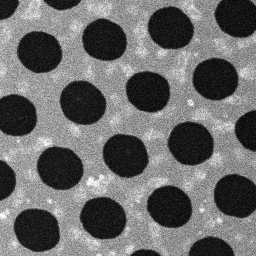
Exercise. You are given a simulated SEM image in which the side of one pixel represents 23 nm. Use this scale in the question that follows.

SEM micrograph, a regular array of holes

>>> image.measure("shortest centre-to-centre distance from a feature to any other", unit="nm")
1520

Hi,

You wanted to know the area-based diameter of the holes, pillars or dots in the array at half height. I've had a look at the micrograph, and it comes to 1030 nm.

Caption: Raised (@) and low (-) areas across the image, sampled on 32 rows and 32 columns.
--@@@@----@@@@@@@@@@@@@@@@@-----
--@@@@@@@@@@@@@@@@@----@@@@-----
@@@@@@@@@@@@--@@@@@-----@@@-----
@@@@@@@@@@@----@@@------@@@-----
@@@----@@@------@@@-----@@@@@--@
@@-----@@@------@@@@----@@@@@@@@
@@------@@@-----@@@@@@@@@@@@@@@@
@@------@@@@@-@@@@@@@@@@@@--@@@@
@@@----@@@@@@@@@@@@@@@@@-----@@@
@@@@@@@@@@@@@@@@@---@@@@------@@
@@@@@@@@@---@@@@-----@@@------@@
@@@@@@@@-----@@@-----@@@@----@@@
----@@@------@@@-----@@@@@--@@@@
----@@@@-----@@@@---@@@@@@@@@@@@
-----@@@-----@@@@@@@@@@@@@@@@@--
-----@@@@@--@@@@@@@@@@---@@@@---
----@@@@@@@@@@@@@@@@@-----@@@---
@@@@@@@@@@@@@-----@@@------@@@--
@@@@@@--@@@@@-----@@@------@@@@-
@@@@@-----@@@------@@@----@@@@@@
-@@@@-----@@@-----@@@@@--@@@@@@@
--@@@-----@@@@----@@@@@@@@@@@@@@
--@@@-----@@@@@@@@@@@@@@@@@----@
--@@@@---@@@@@@@@@@@--@@@@@-----
-@@@@@@@@@@@@@@@@@@----@@@@-----
@@@@@@@@@@@----@@@------@@@-----
@@@---@@@@------@@@-----@@@@----
@@-----@@@------@@@-----@@@@@@@@
@@-----@@@------@@@@@-@@@@@@@@@@
@@------@@@----@@@@@@@@@@@@@@@@@
@@@----@@@@@@@@@@@@@@@@@-----@@@
@@@@-@@@@@@@@@@@@---@@@@-----@@@